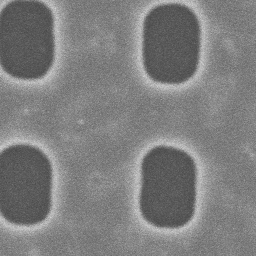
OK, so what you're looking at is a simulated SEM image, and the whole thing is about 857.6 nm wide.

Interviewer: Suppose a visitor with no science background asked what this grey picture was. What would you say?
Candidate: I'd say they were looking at holes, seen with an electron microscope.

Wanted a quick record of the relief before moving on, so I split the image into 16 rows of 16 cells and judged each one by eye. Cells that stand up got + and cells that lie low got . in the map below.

...+++++++..++++
...++++++....+++
...++++++....+++
...++++++....+++
...++++++...++++
++++++++++++++++
++++++++++++++++
++++++++++++++++
++++++++++++++++
...++++++...++++
...++++++...++++
...++++++...++++
...++++++...++++
...++++++...++++
++++++++++++++++
++++++++++++++++